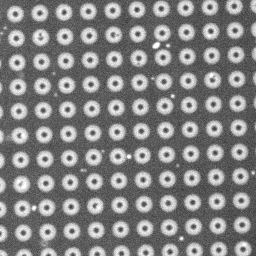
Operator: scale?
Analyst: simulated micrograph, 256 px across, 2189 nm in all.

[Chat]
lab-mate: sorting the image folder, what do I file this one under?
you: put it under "an array of small figures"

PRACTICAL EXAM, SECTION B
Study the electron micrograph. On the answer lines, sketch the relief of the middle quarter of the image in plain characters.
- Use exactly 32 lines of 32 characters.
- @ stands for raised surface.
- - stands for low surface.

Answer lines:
@@---@@@----@@------------------
--------------------------------
------------------------------@@
@-----@@---@@@---@@@---@@@@--@@@
@@@--@@@@--@@@@--@@@@--@@@@--@@@
@@@--@@@@--@@@@--@@@@--@@@@--@@@
@@---@@@----@@----@@------------
--------------------------------
-------------------------------@
------@@----@@----@@@---@@@---@@
@@@--@@@@--@@@@--@@@@--@@@@--@@@
@@@--@@@@--@@@@--@@@@---@@@---@@
@@@--@@@----@@----@@------------
--------------------------------
--------------------------------
------@@----@@@---@@@---@@@---@@
@@@--@@@@--@@@@--@@@@--@@@@---@@
@@@--@@@@--@@@@--@@@@---@@@---@@
@@@---@@@---@@@---@@-----@------
--------------------------------
--------------------------------
-------@----@@@---@@@---@@@---@@
@@@---@@@---@@@---@@@---@@@@--@@
@@@--@@@@---@@@---@@@---@@@---@@
@@@---@@@---@@@---@@@----@------
--------------------------------
--------------------------------
-------@-----@@---@@@---@@@---@@
@@@---@@@---@@@@--@@@@--@@@@--@@
@@@---@@@---@@@@--@@@@--@@@@--@@
@@@---@@@---@@@---@@@----@@-----
-@------------------------------